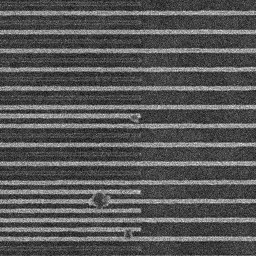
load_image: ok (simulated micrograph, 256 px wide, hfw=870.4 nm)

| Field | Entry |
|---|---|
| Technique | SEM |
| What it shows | parallel lines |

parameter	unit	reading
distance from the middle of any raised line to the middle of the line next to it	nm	32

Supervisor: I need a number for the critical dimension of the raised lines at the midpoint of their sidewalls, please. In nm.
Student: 13.2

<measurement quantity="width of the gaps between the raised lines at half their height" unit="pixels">5.88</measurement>